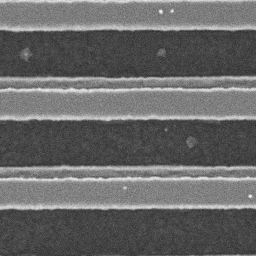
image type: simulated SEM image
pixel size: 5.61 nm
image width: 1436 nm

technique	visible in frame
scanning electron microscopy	lines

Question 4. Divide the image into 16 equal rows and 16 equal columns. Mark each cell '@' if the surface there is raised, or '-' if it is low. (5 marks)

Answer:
@@@@@@@@@@@@@@@@
@@@@@@@@@@@@@@@@
----------------
----------------
----------------
@@@@@@@@@@@@@@@@
@@@@@@@@@@@@@@@@
------@---------
----------------
----------------
---@@@@@@@@@@@@@
@@@@@@@@@@@@@@@@
@@@@@@@@@@@@@@@@
----------------
----------------
----------------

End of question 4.